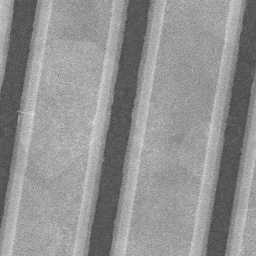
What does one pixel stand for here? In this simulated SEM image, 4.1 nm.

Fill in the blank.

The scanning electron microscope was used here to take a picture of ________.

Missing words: one or a few lines or trenches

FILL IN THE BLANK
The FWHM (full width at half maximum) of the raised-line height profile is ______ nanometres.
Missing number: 298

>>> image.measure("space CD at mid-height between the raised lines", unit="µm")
0.172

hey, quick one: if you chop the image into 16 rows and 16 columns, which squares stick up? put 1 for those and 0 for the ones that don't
0001111000111110
0001111000111110
0001111000111100
0011111000111100
0011111001111100
0011111001111100
0011110001111100
0011110001111100
0011110001111000
0111110001111000
0111110011111000
0111110011111001
0111100011111001
0111100011111001
0111100011110001
0111100011110001